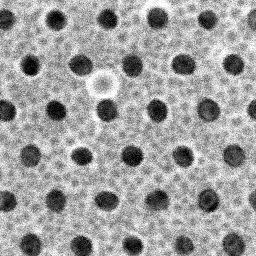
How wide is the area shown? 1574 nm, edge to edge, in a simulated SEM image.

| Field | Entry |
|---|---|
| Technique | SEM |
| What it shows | a regular array of holes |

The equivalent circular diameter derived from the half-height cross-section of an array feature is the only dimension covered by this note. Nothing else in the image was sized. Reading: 139 nm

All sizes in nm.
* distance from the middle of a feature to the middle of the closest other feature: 312